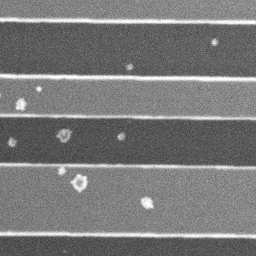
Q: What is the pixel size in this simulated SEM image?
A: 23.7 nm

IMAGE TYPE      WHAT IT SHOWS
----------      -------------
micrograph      lines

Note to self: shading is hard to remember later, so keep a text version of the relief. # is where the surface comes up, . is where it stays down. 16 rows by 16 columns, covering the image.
################
................
................
................
................
################
################
................
................
................
################
################
################
################
################
................